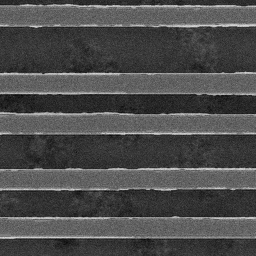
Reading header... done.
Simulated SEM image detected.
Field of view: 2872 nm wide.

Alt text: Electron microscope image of lines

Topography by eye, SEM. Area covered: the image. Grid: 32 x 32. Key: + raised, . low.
................................
++++++++++++++++++++++++++++++++
++++++++++++++++++++++++++++++++
................................
................................
................................
................................
................................
................................
++++++++++++++++++++++++++++++++
++++++++++++++++++++++++++++++++
++++++++++++++++++++++++++++++++
................................
................................
++++++++++++++++++++++++++++++++
++++++++++++++++++++++++++++++++
++++++++++++++++++++++++++++++++
................................
................................
................................
................................
++++++++++++++++++++++++++++++++
++++++++++++++++++++++++++++++++
++++++++++++++++++++++++++++++++
................................
................................
................................
++++++++++++++++++++++++++++++++
++++++++++++++++++++++++++++++++
++++++++++++++++++++++++++++++++
................................
................................